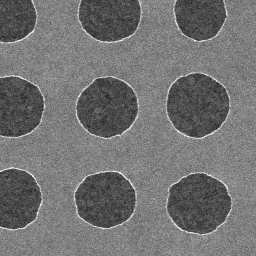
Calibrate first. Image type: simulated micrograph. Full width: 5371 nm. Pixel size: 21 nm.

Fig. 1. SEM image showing raised bodies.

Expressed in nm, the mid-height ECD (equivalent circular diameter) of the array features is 1300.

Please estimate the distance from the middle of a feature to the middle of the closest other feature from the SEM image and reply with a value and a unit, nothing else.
1910 nm